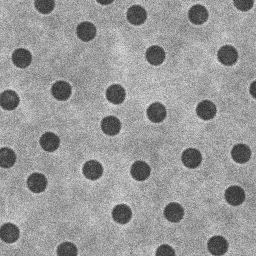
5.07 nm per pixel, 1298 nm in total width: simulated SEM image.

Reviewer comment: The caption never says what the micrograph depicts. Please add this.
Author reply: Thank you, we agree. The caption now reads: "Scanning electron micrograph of a regular array of holes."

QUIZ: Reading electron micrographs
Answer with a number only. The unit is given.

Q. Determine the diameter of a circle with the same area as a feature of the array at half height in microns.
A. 0.11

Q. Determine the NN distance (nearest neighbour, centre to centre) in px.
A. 47